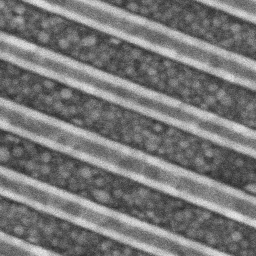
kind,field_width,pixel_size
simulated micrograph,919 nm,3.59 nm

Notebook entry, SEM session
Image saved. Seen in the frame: one or a few lines or trenches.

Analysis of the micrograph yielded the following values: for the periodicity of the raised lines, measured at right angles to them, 227 nm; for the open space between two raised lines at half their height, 153 nm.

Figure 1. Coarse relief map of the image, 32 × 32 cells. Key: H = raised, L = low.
LLLLLHHHHHHHLLLLLLLLLLLLLLLHHHHH
LLLLLLLHHHHHHHHLLLLLLLLLLLLLLHHH
LLLLLLLLLLHHHHHHHHLLLLLLLLLLLLLL
LLLLLLLLLLLLLHHHHHHHLLLLLLLLLLLL
LLLLLLLLLLLLLLLHHHHHHHHLLLLLLLLL
HHHLLLLLLLLLLLLLLLHHHHHHHLLLLLLL
HHHHHHLLLLLLLLLLLLLLHHHHHHHHLLLL
LLHHHHHHLLLLLLLLLLLLLLLHHHHHHHLL
LLLLHHHHHHHLLLLLLLLLLLLLLHHHHHHH
LLLLLLLHHHHHHLLLLLLLLLLLLLLLHHHH
LLLLLLLLLHHHHHHHLLLLLLLLLLLLLLLH
LLLLLLLLLLLLHHHHHHLLLLLLLLLLLLLL
LLLLLLLLLLLLLLHHHHHHHLLLLLLLLLLL
HHHLLLLLLLLLLLLLLHHHHHHHLLLLLLLL
HHHHHLLLLLLLLLLLLLLLHHHHHHLLLLLL
HHHHHHHHLLLLLLLLLLLLLLHHHHHHHLLL
LLHHHHHHHHLLLLLLLLLLLLLLLHHHHHHL
LLLLLHHHHHHHHLLLLLLLLLLLLLLHHHHH
LLLLLLLHHHHHHHHLLLLLLLLLLLLLLLHH
LLLLLLLLLLHHHHHHHHLLLLLLLLLLLLLL
LLLLLLLLLLLLHHHHHHHHLLLLLLLLLLLL
HLLLLLLLLLLLLLLHHHHHHHHLLLLLLLLL
HHHLLLLLLLLLLLLLLLHHHHHHHLLLLLLL
HHHHHHLLLLLLLLLLLLLLHHHHHHHHLLLL
LHHHHHHHHLLLLLLLLLLLLLLHHHHHHHHL
LLLLHHHHHHHLLLLLLLLLLLLLLHHHHHHH
LLLLLLLHHHHHHHLLLLLLLLLLLLLLHHHH
LLLLLLLLLHHHHHHHLLLLLLLLLLLLLLHH
LLLLLLLLLLLLHHHHHHHLLLLLLLLLLLLL
LLLLLLLLLLLLLLHHHHHHHLLLLLLLLLLL
HHHLLLLLLLLLLLLLLHHHHHHHLLLLLLLL
HHHHHLLLLLLLLLLLLLLHHHHHHHHLLLLL